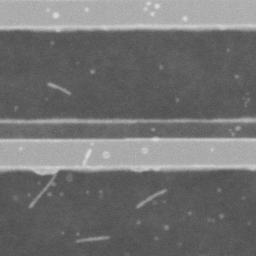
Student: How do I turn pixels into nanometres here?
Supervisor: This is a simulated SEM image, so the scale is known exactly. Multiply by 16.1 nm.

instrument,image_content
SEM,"lines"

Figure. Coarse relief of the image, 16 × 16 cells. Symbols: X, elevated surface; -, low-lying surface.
XXXXXXXXXXXXXXXX
XXXXXXXXXXXXXXXX
----------------
----------------
----------------
----------------
----------------
----------------
XXXXXXXXXXXXXXXX
XXXXXXXXXXXXXXXX
X-XX-X--XX-----X
----------------
----------------
----------------
----------------
----------------